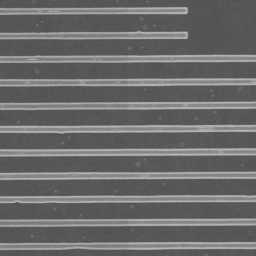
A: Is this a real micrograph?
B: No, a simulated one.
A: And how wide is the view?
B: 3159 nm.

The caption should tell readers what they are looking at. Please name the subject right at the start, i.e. parallel lines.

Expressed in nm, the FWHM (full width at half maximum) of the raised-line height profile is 69.4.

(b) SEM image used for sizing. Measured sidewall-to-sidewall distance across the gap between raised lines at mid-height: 18.1 px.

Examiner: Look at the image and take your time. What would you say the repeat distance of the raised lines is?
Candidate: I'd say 0.29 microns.